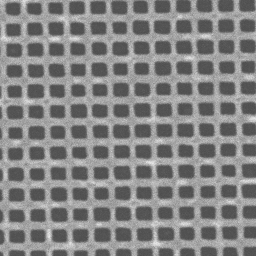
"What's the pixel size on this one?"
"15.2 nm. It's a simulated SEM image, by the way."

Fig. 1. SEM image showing a regular array of holes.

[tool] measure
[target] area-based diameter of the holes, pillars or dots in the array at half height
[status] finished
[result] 0.247 micrometres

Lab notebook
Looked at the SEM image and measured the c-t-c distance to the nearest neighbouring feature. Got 312 nm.